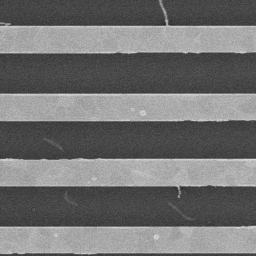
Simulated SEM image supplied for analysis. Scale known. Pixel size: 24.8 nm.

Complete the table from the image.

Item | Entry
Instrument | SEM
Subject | lines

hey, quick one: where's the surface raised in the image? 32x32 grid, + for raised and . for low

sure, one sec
................................
................................
................................
++++++++++++++++++++++++++++++++
++++++++++++++++++++++++++++++++
++++++++++++++++++++++++++++++++
+++++++++++++++++......++....++.
................................
................................
................................
................................
................................
++++++++++++++++++++++++++++++++
++++++++++++++++++++++++++++++++
++++++++++++++++++++++++++++++++
................................
................................
................................
................................
................................
++++++++++++++++++++++++++++++++
++++++++++++++++++++++++++++++++
++++++++++++++++++++++++++++++++
................................
................................
................................
................................
................................
++++++++++++++++++++++++++++++++
++++++++++++++++++++++++++++++++
++++++++++++++++++++++++++++++++
++++++++++++++++++++++++++++++++